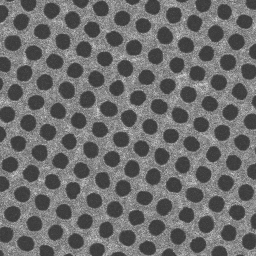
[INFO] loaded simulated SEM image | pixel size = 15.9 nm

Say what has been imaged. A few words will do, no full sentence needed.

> a regular array of holes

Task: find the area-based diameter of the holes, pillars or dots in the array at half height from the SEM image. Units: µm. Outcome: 0.257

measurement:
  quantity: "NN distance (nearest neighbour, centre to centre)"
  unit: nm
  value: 348